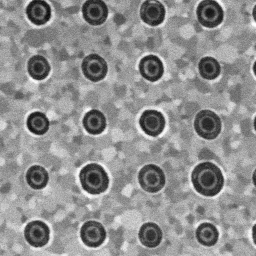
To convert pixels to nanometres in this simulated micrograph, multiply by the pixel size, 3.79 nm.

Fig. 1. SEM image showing a regular array of ring-shaped grooves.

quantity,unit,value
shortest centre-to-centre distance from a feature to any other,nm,207